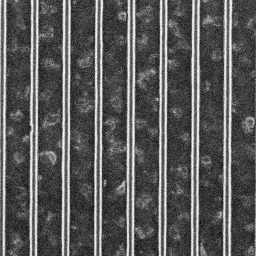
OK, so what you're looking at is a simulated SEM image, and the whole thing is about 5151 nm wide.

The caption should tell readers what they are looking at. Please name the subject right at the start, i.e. parallel lines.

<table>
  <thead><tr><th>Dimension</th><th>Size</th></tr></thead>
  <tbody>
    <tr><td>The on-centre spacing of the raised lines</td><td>648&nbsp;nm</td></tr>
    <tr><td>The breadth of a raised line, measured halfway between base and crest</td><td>111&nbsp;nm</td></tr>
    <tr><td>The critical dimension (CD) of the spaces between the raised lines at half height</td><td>0.533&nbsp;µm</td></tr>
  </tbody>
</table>